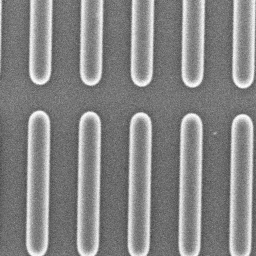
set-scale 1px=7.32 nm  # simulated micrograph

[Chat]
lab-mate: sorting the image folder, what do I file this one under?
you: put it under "groups of lines, slits or small figures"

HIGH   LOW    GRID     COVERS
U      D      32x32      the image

DDDDUUDDDDUUUDDDDUUDDDDUUUDDDUUU
DDDDUUDDDDUUUDDDDUUDDDDUUUDDDUUU
DDDDUUDDDDUUUDDDDUUDDDDUUDDDDUUU
DDDDUUDDDDUUUDDDDUUDDDDUUDDDDUUU
DDDDUUDDDDUUUDDDDUUDDDDUUDDDDUUU
DDDDUUDDDDUUUDDDDUUDDDDUUDDDDUUU
DDDDUUDDDDUUUDDDDUUDDDDUUDDDDUUU
DDDDUUDDDDUUUDDDDUUDDDDUUDDDDUUU
DDDDUUDDDDUUUDDDDUUDDDDUUDDDDUUU
DDDDUUDDDDUUUDDDDUUDDDDUUDDDDUUU
DDDDDDDDDDDUDDDDDUDDDDDUUDDDDDUD
DDDDDDDDDDDDDDDDDDDDDDDDDDDDDDDD
DDDDDDDDDDDDDDDDDDDDDDDDDDDDDDDD
DDDDDDDDDDDDDDDDDDDDDDDDDDDDDDDD
DDDDUUDDDDUUDDDDDUDDDDDUUDDDDDUD
DDDDUUDDDDUUDDDDUUUDDDDUUDDDDUUD
DDDDUUDDDDUUDDDDUUUDDDDUUDDDDUUD
DDDDUUDDDDUUDDDDUUUDDDDUUDDDDUUD
DDDDUUDDDDUUDDDDUUUDDDDUUDDDDUUD
DDDDUUDDDDUUDDDDUUUDDDDUUDDDDUUD
DDDDUUDDDDUUDDDDUUUDDDDUUDDDDUUD
DDDDUUDDDDUUDDDDUUUDDDDUUDDDDUUD
DDDDUUDDDDUUDDDDUUUDDDDUUDDDDUUD
DDDUUUDDDDUUDDDDUUUDDDUUUDDDDUUD
DDDUUUDDDDUUDDDDUUUDDDUUUDDDDUUD
DDDUUUDDDDUUDDDDUUUDDDUUUDDDDUUD
DDDUUUDDDDUUDDDDUUUDDDUUUDDDDUUD
DDDUUUDDDDUUDDDDUUUDDDUUUDDDDUUD
DDDUUUDDDDUUDDDDUUUDDDUUUDDDDUUD
DDDUUUDDDDUUDDDDUUUDDDUUUDDDDUUD
DDDUUUDDDDUUDDDDUUUDDDUUUDDDDUUD
DDDDUUDDDDUUDDDDUUDDDDUUUDDDDUUD